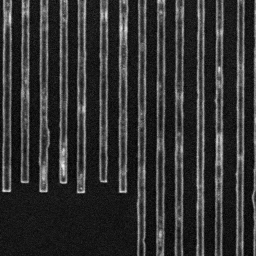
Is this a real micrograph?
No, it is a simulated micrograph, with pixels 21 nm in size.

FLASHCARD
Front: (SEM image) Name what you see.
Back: parallel lines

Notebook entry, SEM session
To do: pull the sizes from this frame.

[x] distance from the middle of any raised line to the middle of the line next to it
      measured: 410 nm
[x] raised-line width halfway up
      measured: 7.12 pixels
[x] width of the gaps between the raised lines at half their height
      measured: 244 nm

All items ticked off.